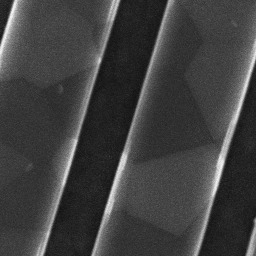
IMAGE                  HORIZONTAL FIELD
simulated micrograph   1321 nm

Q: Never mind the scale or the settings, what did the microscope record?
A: one or a few lines or trenches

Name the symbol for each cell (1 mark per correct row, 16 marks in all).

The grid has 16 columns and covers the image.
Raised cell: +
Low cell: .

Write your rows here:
.++++++...++++++
.++++++...++++++
+++++++...++++++
++++++....++++++
++++++...+++++++
++++++...++++++.
+++++....++++++.
+++++...+++++++.
+++++...++++++..
+++++...++++++..
++++...+++++++..
++++...+++++++..
++++...++++++...
+++....++++++...
+++...+++++++...
+++...++++++....